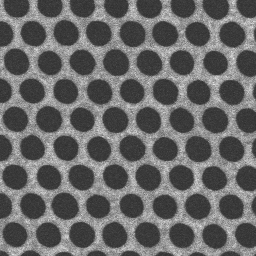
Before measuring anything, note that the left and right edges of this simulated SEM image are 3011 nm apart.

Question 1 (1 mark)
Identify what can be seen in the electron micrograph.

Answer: a regular array of holes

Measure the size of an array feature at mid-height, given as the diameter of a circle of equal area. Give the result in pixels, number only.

25.5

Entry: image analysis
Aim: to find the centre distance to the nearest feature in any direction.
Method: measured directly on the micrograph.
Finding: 383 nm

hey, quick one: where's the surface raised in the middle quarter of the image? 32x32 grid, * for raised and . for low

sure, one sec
*.......**......**.......**.....
**.....***......***.....***.....
***...******...*****...*****...*
********************************
..*****....****....****....*****
...***.....***......**......***.
...***......**......**.......*..
....**......**......**.......**.
...***......**......**......***.
..*****....****....*****....****
********************************
***...*****....****....****....*
**.....***......**......***.....
*.......*.......**......**......
**......**......**......***.....
**.....***......**......***.....
***....****....****....*****....
*********************.**********
..*****...*****....*****..*****.
...***.....***......***.....***.
....**......**......**......**..
....**......**......**......**..
...***......**......***.....***.
...****....****....****.....***.
*****************.**************
**...******...*****...******..**
*......***.....***......***.....
*......***......**......**......
*.......**......**......**......
**.....***......**......**......
**.....****....****.....***.....
****..**************..*******..*